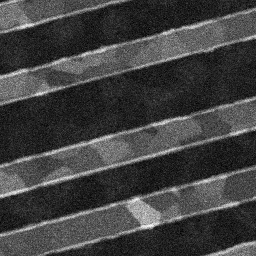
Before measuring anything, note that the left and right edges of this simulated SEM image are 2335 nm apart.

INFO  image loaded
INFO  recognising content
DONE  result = one or a few lines or trenches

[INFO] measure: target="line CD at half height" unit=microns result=0.257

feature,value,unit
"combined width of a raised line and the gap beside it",714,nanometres